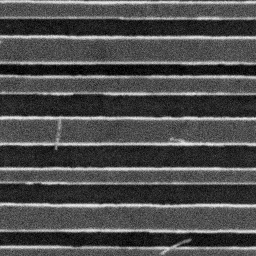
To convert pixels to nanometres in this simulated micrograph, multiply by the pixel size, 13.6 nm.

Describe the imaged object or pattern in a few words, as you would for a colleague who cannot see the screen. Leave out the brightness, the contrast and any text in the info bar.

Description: lines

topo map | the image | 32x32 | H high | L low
HHHHHHHHHHHHHHHHHHHHHHHHHHHHHHHH
HHHHHHHHHHHHHHHHHHHHHHHHHHHHHHHH
LLLLLLLLLLLLLLLLLLLLLLLLLLLLLLLL
LLLLLLLLLLLLLLLLLLLLLLLLLLLLLLLL
LLLLLLLLLLLLLLLLLLLLLLLLLLLLLLLL
HHHHHHHHHHHHHHHHHHHHHHHHHHHHHHHH
HHHHHHHHHHHHHHHHHHHHHHHHHHHHHHHH
HHHHHHHHHHHHHHHHHHHHHHHHHHHHHHHH
LLLLLLLLLLLLLLLLLLLLLLLLLLLLLLLL
LLLLLLLLLLLLLLLLLLLLLLLLLLLLLLLL
HHHHHHHHHHHHHHHHHHHHHHHHHHHHHHHH
HHHHHHHHHHHHHHHHHHHHHHHHHHHHHHHH
LLLLLLLLLLLLLLLLLLLLLLLLLLLLLLLL
LLLLLLLLLLLLLLLLLLLLLLLLLLLLLLLL
LLLLLLLLLLLLLLLLLLLLLLLLLLLLLLLL
HHHHHHHHHHHHHHHHHHHHHHHHHHHHHHHH
HHHHHHHHHHHHHHHHHHHHHHHHHHHHHHHH
HHHHHHHHHHHHHHHHHHHHHHHHHHHHHHHH
LLLLLLLLLLLLLLLLLLLLLLLLLLLLLLLL
LLLLLLLLLLLLLLLLLLLLLLLLLLLLLLLL
LLLLLLLLLLLLLLLLLLLLLLLLLLLLLLLL
HHHHHHHHHHHHHHHHHHHHHHHHHHHHHHHH
HHHHHHHHHHHHHHHHHHHHHHHHHHHHHHHH
LLLLLLLLLLLLLLLLLLLLLLLLLLLLLLLL
LLLLLLLLLLLLLLLLLLLLLLLLLLLLLLLL
LLLLLLLLLLLLLLLLLLLLLLLLLLLLLLLL
HHHHHHHHHHHHHHHHHHHHHHHHHHHHHHHH
HHHHHHHHHHHHHHHHHHHHHHHHHHHHHHHH
HHHHHHHHHHHHHHHHHHHHHHHHHHHHHHHH
LLLLLLLLLLLLLLLLLLLLLLLLLLLLLLLL
LLLLLLLLLLLLLLLLLLLLLLLLLLLLLLLL
HHHHHHHHHHHHHHHHHHHHHHHHHHHHHHHH